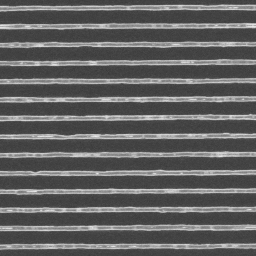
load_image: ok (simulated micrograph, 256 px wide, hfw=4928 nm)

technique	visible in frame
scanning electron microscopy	parallel lines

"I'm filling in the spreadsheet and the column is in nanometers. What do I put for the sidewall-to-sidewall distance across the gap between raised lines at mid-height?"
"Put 277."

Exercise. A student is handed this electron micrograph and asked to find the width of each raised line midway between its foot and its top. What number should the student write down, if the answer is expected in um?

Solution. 0.0818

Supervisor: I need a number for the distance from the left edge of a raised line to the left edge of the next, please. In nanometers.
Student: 353